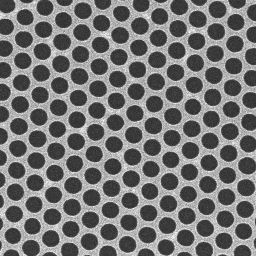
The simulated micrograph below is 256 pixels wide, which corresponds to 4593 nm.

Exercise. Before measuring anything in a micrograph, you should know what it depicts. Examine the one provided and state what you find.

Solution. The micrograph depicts a regular array of holes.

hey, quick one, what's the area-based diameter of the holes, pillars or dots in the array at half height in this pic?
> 306 nm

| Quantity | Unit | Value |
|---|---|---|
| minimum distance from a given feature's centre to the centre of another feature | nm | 390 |